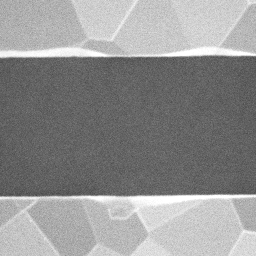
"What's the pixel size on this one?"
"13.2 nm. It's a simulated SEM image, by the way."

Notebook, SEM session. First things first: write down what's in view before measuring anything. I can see wiring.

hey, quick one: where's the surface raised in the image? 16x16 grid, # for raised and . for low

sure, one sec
################
################
################
................
................
................
................
................
................
................
................
................
#######...######
################
################
################